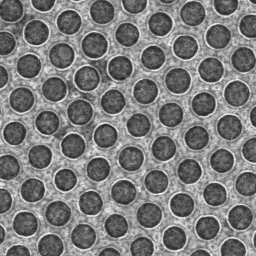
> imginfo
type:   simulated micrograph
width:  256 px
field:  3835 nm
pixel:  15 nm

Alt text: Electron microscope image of a regular array of holes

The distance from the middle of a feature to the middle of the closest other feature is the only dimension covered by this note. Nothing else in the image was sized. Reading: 512 nanometers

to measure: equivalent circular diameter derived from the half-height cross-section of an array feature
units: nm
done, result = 376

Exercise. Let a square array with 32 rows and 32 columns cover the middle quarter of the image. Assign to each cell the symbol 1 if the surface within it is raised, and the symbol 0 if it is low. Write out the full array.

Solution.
00111001111000000111000001111111
11100000111000000111110111100011
11100000011000000111111111000001
11100000011100001111111110000000
11100000011111111100000110000000
01100000011111111100000111000001
01110001111000111000000011000001
01111111110000011000000011100111
11111111100000011100000111111111
11000011100000011100001111111111
10000001100000011111111100000111
10000001110000011111111100000011
10000001111101111100111100000011
10000001111111110000011100000011
11000011111111110000001100000111
11111111100011110000001110001111
11111111000001110000001111111110
10011110000001110000011111111100
00000110000001111111111000011100
00000111000001111111110000001100
00000111000011111111110000001110
00000111111111000001110000001111
00000111111111000000110000001111
10011111001111000000111000011111
11111100000111000000111111111000
11111100000011000001111111110000
00111000000011100011110011110000
00011100000111111111100001110000
00011100000111111111000000111000
00011111011110000111000000111100
00011111111100000011000000111111
00111111111100000011100000111111